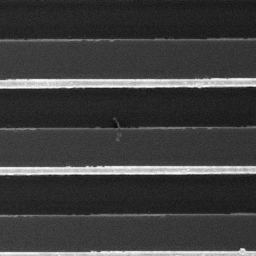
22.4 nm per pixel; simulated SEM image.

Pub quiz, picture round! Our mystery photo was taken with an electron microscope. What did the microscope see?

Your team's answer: lines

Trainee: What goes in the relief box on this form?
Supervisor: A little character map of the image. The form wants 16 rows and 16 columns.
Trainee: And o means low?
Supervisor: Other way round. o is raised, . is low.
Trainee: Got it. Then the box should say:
................
................
....oooooooooooo
oooooooooooooooo
oooooooooooooooo
................
................
................
oooooooooooooooo
oooooooooooooooo
oooooooooooooooo
................
................
oooooooooooooooo
oooooooooooooooo
oooooooooooooooo